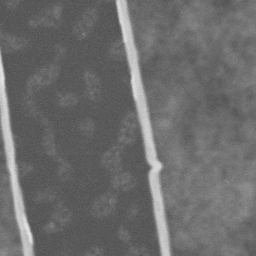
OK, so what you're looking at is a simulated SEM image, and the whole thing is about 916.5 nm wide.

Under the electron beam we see one or a few lines or trenches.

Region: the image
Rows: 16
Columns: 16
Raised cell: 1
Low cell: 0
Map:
1111111100000000
1111111100000000
1111111100000000
1111111100000000
1111111100000000
1111111110000000
1111111110000000
1111111110000000
1111111110000000
0111111110000000
0111111111000000
0111111111000000
0111111111000000
0111111111000000
0111111111000000
0011111111000000